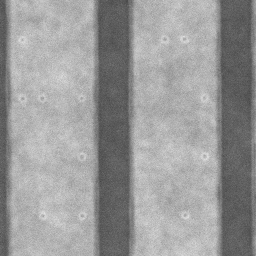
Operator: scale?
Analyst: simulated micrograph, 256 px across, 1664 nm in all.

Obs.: wiring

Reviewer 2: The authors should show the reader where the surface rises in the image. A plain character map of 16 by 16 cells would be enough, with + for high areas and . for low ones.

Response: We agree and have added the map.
++++++..++++++..
.+++++..++++++..
.+++++..++++++..
++++++..++++++..
++++++..++++++..
++++++..++++++..
++++++..++++++..
.+++++..++++++..
.+++++..++++++..
.+++++..++++++..
.+++++..++++++..
++++++..++++++..
++++++..++++++..
.+++++..++++++..
.+++++..++++++..
.+++++..++++++..